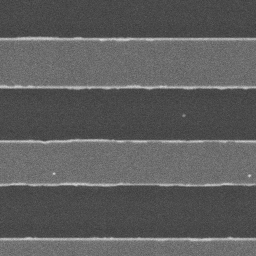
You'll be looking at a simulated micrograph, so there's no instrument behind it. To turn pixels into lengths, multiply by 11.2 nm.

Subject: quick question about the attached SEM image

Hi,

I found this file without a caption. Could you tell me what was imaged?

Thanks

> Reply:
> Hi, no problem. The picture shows lines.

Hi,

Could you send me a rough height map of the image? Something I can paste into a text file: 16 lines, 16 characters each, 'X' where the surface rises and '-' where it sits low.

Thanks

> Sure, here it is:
----------------
----------------
XXXXXXXXXXXXXXXX
XXXXXXXXXXXXXXXX
XXXXXXXXXXXXXXXX
----------------
----------------
----------------
----------------
XXXXXXXXXXXXXXXX
XXXXXXXXXXXXXXXX
XXXXXXXXXXXXXXXX
----------------
----------------
----------------
XXXXXXXXXXXXXXXX